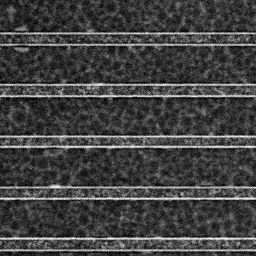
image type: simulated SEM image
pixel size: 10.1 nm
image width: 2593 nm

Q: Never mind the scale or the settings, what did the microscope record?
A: parallel lines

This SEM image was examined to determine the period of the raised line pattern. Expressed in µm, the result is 0.519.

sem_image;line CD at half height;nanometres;119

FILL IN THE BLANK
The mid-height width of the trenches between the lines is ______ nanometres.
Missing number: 400